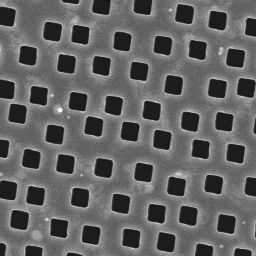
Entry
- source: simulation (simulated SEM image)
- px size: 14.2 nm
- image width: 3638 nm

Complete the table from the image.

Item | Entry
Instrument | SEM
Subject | a regular array of holes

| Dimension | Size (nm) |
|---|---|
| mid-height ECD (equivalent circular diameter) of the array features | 282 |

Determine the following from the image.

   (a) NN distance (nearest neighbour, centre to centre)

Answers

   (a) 456 nm